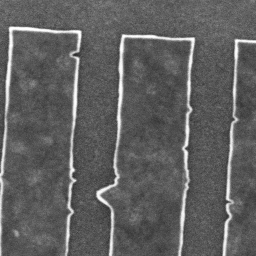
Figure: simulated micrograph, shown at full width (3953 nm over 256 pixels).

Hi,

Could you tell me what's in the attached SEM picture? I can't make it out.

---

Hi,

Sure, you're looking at one or a few lines or trenches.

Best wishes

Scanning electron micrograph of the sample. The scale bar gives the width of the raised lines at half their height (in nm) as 1070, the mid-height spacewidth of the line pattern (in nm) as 665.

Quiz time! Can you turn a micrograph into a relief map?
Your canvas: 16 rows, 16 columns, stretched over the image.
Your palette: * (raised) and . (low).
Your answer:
................
................
.****...****....
.****...****...*
.****...****...*
*****...****...*
*****..*****...*
*****..*****...*
*****..*****..**
****...*****..**
****...*****..**
*****..*****..**
****..******..**
****...****...**
****...****...**
****...****...**